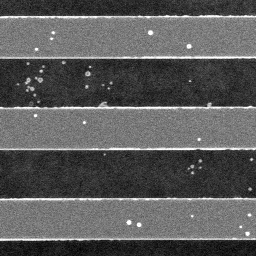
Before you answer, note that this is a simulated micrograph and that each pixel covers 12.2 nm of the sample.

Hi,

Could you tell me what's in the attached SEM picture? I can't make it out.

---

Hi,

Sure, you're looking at lines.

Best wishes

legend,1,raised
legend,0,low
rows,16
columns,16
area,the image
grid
0000000000000000
1111111111111111
1111111111111111
1111111111111111
0000000000000000
0000000000000000
0000000000000000
1111111111111111
1111111111111111
0000000000000000
0000000000000000
0000000000000000
1111111111111111
1111111111111111
1111111111111111
0000000000000000